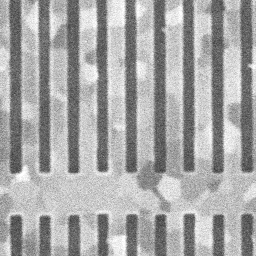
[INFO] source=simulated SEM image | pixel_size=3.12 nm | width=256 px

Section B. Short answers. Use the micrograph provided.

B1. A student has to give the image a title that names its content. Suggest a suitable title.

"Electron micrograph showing parallel lines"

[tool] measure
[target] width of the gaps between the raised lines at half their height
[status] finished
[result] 41 nm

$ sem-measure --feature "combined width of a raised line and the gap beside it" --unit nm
90.2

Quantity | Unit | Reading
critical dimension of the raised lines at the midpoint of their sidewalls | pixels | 15.9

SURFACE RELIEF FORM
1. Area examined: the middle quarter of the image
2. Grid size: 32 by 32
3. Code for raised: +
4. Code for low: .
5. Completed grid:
....++++...++++...++++....+++...
+...++++...++++...++++....+++...
....++++...++++...++++....+++...
....++++...++++...++++....+++...
....++++...++++...++++....+++...
....++++...++++...++++....+++...
+...++++...++++....+++....+++...
+...++++...++++....+++....+++...
+...++++...++++....+++....+++...
+...++++...++++....+++....+++...
+...++++...++++....+++....+++...
+...++++...++++....+++....+++...
+...++++...++++....+++....+++...
+...++++...++++....+++....++++..
+...++++...++++....+++....++++..
+...++++...++++....+++....++++..
+...++++...++++....+++....++++..
+...++++...++++....+++....++++..
+...++++...++++....+++....++++..
+...++++...++++....+++....++++..
+...++++...++++....+++....++++..
+...++++...++++....+++....++++..
+...++++...++++....+++....++++..
+...++++...++++....+++....++++..
+...++++...++++....+++....++++..
+...++++...++++....+++....++++..
+...++++...++++....+++....++++..
+..+++++++++++++..+++++..+++++++
++++++++++++++++++++++++++++++++
++++++++++++++++++++++++++++++++
++++++++++++++++++++++++++++++++
++++++++++++++++++++++++++++++++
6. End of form